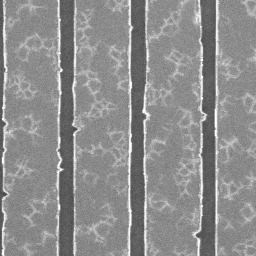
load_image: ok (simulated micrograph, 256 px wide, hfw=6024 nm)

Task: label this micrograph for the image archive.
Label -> one or a few lines or trenches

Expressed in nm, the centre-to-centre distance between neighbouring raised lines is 1670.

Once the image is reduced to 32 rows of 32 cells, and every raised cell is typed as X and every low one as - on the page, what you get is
-XXXXXX--XXXXXXX--XXXXXXX--XXXXX
-XXXXXX--XXXXXXX--XXXXXXX--XXXXX
-XXXXXX--XXXXXXX--XXXXXXX--XXXXX
XXXXXXX--XXXXXXX--XXXXXXX--XXXXX
XXXXXXX--XXXXXXX--XXXXXXX--XXXXX
-XXXXXX--XXXXXXX--XXXXXXX--XXXXX
-XXXXXX---XXXXXX--XXXXXXX--XXXXX
-XXXXXX--XXXXXXX--XXXXXXX--XXXXX
-XXXXXX--XXXXXXX--XXXXXXX--XXXXX
-XXXXXX--XXXXXXX--XXXXXXX--XXXXX
-XXXXXX--XXXXXXX--XXXXXXX--XXXXX
-XXXXXX--XXXXXXX--XXXXXXX--XXXXX
XXXXXXX--XXXXXXX--XXXXXXX--XXXXX
XXXXXXX--XXXXXXX--XXXXXXX--XXXXX
XXXXXXX--XXXXXXX--XXXXXXXX-XXXXX
-XXXXXX--XXXXXXX--XXXXXXX--XXXXX
-XXXXXX--XXXXXXX--XXXXXXX--XXXXX
-XXXXXX--XXXXXXX--XXXXXXX--XXXXX
-XXXXXX--XXXXXXX--XXXXXXX--XXXXX
XXXXXXX--XXXXXXX--XXXXXXX--XXXXX
XXXXXXX--XXXXXXX--XXXXXXX--XXXXX
XXXXXXX--XXXXXXX--XXXXXXX--XXXXX
XXXXXXX--XXXXXXX--XXXXXXX--XXXXX
XXXXXXX--XXXXXXX--XXXXXXX--XXXXX
-XXXXXX--XXXXXXX--XXXXXXX--XXXXX
XXXXXXX--XXXXXXX--XXXXXXX--XXXXX
XXXXXXX--XXXXXXX--XXXXXXX--XXXXX
XXXXXXX--XXXXXXX--XXXXXXX--XXXXX
XXXXXXX--XXXXXXX--XXXXXXX--XXXXX
XXXXXXX--XXXXXXX--XXXXXXX--XXXXX
XXXXXXX--XXXXXXX--XXXXXXX--XXXXX
XXXXXXX--XXXXXXX--XXXXXXX--XXXXX